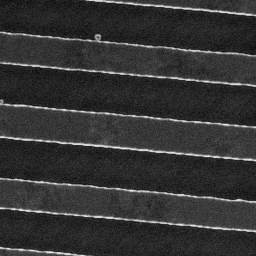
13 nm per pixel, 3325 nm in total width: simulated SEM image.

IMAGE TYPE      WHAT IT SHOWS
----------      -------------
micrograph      lines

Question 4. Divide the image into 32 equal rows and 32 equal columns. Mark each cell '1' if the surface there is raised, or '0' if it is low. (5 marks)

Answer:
00000000000000001111111111111111
00000000000000000000000000011111
00000000000000000000000000000000
00000000000000000000000000000000
11111000000000000000000000000000
11111111111111110000000000000000
11111111111111111111111111100000
11111111111111111111111111111111
00000001111111111111111111111111
00000000000000000011111111111111
00000000000000000000000000001111
00000000000000000000000000000000
00000000000000000000000000000000
11111100000000000000000000000000
11111111111111111000000000000000
11111111111111111111111111110000
11111111111111111111111111111111
00001111111111111111111111111111
00000000000000011111111111111111
00000000000000000000000001111111
00000000000000000000000000000000
00000000000000000000000000000000
11000000000000000000000000000000
11111111111111000000000000000000
11111111111111111111111100000000
11111111111111111111111111111111
00000111111111111111111111111111
00000000000000001111111111111111
00000000000000000000000000111111
00000000000000000000000000000000
00000000000000000000000000000000
11111000000000000000000000000000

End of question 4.